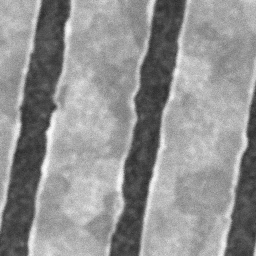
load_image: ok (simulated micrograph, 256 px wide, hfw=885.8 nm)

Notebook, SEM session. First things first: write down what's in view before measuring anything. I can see one or a few lines or trenches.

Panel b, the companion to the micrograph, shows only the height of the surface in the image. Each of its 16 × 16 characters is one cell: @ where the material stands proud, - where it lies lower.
@@--@@@@@@--@@@@
@@--@@@@@--@@@@@
@@--@@@@@--@@@@@
@@--@@@@@--@@@@@
@@--@@@@@--@@@@@
@---@@@@@--@@@@@
@--@@@@@--@@@@@@
@--@@@@@--@@@@@-
@--@@@@@--@@@@@-
@--@@@@@--@@@@@-
@--@@@@@--@@@@@-
--@@@@@@-@@@@@@-
--@@@@@@-@@@@@@-
--@@@@@--@@@@@--
--@@@@@--@@@@@--
--@@@@@--@@@@@--